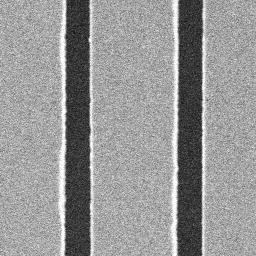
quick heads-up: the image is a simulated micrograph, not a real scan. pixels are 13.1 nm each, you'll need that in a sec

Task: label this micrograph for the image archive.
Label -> lines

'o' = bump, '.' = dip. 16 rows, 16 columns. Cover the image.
oooo..ooooo..ooo
oooo..ooooo..ooo
oooo..ooooo..ooo
oooo..ooooo..ooo
oooo..ooooo..ooo
oooo..ooooo..ooo
oooo..ooooo..ooo
oooo..ooooo..ooo
oooo..ooooo..ooo
oooo..ooooo..ooo
oooo..ooooo..ooo
oooo..ooooo..ooo
oooo..ooooo..ooo
oooo..ooooo..ooo
oooo..ooooo..ooo
oooo..ooooo..ooo